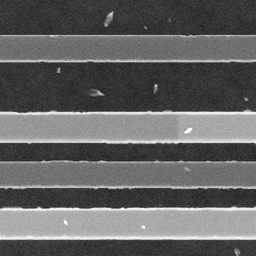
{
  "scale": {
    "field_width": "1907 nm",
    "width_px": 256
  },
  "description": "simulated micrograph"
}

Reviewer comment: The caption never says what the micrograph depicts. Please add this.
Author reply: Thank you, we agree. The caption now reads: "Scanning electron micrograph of lines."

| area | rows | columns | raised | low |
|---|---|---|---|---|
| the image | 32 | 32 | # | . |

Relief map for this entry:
................................
................................
................................
................................
################################
################################
################################
################################
................................
................................
................................
................................
................................
................................
################################
################################
################################
################################
................................
................................
################################
################################
################################
................................
................................
................................
################################
################################
################################
################################
................................
................................